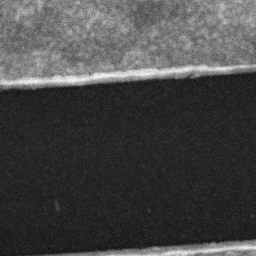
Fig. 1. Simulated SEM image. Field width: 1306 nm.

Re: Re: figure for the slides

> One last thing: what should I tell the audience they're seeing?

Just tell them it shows one or a few lines or trenches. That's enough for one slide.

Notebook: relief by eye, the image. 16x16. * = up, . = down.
****************
****************
****************
****************
**********......
................
................
................
................
................
................
................
................
................
................
...............*